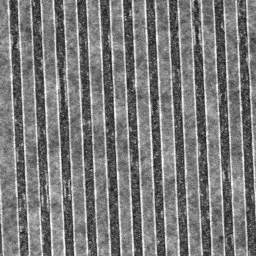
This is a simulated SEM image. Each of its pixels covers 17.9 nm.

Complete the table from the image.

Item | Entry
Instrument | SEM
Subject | parallel lines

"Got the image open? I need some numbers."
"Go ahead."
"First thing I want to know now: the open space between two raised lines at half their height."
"179 nm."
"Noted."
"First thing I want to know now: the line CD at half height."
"219 nanometres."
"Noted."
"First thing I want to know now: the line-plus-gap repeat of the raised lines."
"409 nanometres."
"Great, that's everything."